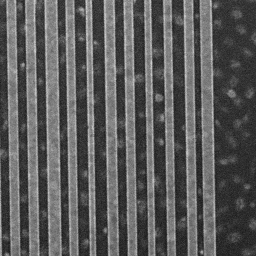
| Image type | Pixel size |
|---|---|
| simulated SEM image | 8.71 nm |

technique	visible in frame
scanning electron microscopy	parallel lines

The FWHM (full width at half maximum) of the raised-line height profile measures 74.1 nanometers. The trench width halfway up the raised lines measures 90.4 nanometers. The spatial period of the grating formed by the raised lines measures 170 nm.